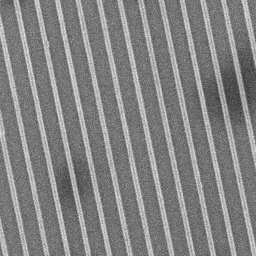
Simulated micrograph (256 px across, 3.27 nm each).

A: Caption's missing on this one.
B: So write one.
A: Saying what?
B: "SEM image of parallel lines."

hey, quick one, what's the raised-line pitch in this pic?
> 20.3 px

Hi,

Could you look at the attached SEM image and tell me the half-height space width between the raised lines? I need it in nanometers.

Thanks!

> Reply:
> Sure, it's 53.6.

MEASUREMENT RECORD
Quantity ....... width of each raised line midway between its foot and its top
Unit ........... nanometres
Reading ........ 12.4